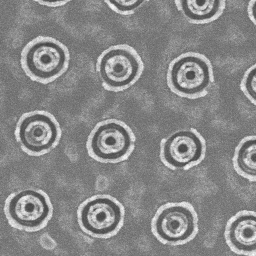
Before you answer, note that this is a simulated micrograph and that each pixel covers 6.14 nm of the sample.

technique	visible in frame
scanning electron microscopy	a regular array of ring-shaped grooves with a dot in the middle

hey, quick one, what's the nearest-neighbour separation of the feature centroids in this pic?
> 447 nanometers